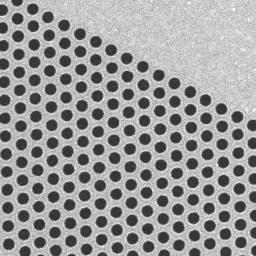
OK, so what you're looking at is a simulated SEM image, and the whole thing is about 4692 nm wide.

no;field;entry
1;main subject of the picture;a regular array of holes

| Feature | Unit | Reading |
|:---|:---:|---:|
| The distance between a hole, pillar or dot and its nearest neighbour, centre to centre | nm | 322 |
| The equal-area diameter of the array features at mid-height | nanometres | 226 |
